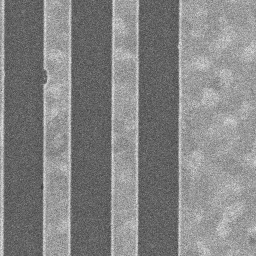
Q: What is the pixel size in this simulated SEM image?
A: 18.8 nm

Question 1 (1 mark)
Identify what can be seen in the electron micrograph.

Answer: one or a few lines or trenches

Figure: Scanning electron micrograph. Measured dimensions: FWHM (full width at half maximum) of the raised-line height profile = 460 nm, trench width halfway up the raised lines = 43.4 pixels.